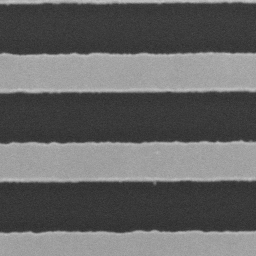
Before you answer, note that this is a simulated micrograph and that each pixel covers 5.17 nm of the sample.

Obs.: lines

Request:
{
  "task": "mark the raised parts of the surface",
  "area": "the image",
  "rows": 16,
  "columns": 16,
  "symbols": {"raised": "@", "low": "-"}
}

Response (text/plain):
----------------
----------------
----------------
@@@@@@@@@@@@@@@@
@@@@@@@@@@@@@@@@
@@@@@@@@@@@@@@@@
----------------
----------------
----------------
@@@@@@@@@@@@@@@@
@@@@@@@@@@@@@@@@
----------------
----------------
----------------
-@-@@@@-@@@@@@@@
@@@@@@@@@@@@@@@@